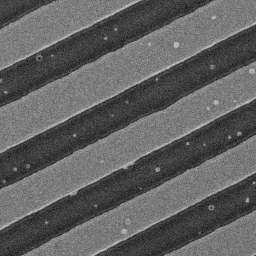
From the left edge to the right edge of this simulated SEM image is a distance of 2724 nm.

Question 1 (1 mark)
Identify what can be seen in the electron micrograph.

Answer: lines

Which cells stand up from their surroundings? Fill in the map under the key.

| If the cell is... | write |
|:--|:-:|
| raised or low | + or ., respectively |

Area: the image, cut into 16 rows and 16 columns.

..++++++.....+++
.+++++.....+++++
++++.....+++++..
++.....+++++....
.....+++++.....+
...+++++.....+++
.+++++.....++++.
++++.....++++...
++.....++++.....
.....++++.....++
...+++++....++++
.+++++....+++++.
++++....+++++...
++....+++++....+
....+++++....+++
..+++++....+++++